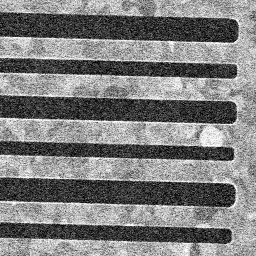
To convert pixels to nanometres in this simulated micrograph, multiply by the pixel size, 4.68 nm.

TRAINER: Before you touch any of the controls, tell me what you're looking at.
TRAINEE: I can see parallel lines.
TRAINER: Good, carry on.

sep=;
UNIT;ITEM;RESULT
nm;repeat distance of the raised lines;192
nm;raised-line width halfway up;103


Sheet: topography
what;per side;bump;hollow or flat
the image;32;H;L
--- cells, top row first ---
HHHHHHHHHHHHHHHHHHHHHHHHHHHHHHHH
LLHHHHHHHHHHHHHHHHHHHHHHHHHHHHHH
LLLLLLLLLLLLLLLLLLLLLLLLLLLLLHHH
LLLLLLLLLLLLLLLLLLLLLLLLLLLLLLHH
LLLLLLLLLLLLLLLLLLLLLLLLLLLLLLHH
HHHHHHHHHHHHHHHHHHHHHHHHHHHHHHHH
HHHHHHHHHHHHHHHHHHHHHHHHHHHHHHHH
LLLLLLLLLLLLLLLLHHHHHHHHHHHHHHHH
LLLLLLLLLLLLLLLLLLLLLLLLLLLLLLHH
HHHHHHHHHHHHLLLLLLLLLLLLLLLLLLHH
HHHHHHHHHHHHHHHHHHHHHHHHHHHHHHHH
HHHHHHHHHHHHHHHHHHHHHHHHHHHHHHHH
LLLLLLLLLLLLLLLLLLLLLLLLLHHHHHHH
LLLLLLLLLLLLLLLLLLLLLLLLLLLLLLHH
LLLLLLLLLLLLLLLLLLLLLLLLLLLLLLHH
HHHHHHHHHHHHHHHHHHHHHHHHHHLLLHHH
HHHHHHHHHHHHHHHHHHHHHHHHHHHHHHHH
LHHHHHHHHHHHHHHHHHHHHHHHHHHHHHHH
LLLLLLLLLLLLLLLLLLLLLLLLLLLLLHHH
HHLLLLLLLLLLLLLLLLLLLLLLLLLLLHHH
HHHHHHHHHHHHHHHHHHHHHHHHHHHHHHHH
HHHHHHHHHHHHHHHHHHHHHHHHHHHHHHHH
LLLLLLLLLLLLLLLHHHHHHHHHHHHHHHHH
LLLLLLLLLLLLLLLLLLLLLLLLLLLLLHHH
LLLLLLLLLLLLLLLLLLLLLLLLLLLLLLHH
HHHHHHHHLHHLLLLLLLLLLLLLLLLLLHHH
HHHHHHHHHHHHHHHHHHHHHHHHHHHHHHHH
HHHHHHHHHHHHHHHHHHHHHHHHHHHHHHHH
LLLLLLLLLLLLLLLLLLLLLLLLLLLLHHHH
LLLLLLLLLLLLLLLLLLLLLLLLLLLLLHHH
HHHHHHHHHHHHHHHHHHHHHHHHHHLLHHHH
HHHHHHHHHHHHHHHHHHHHHHHHHHHHHHHH